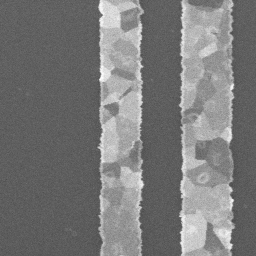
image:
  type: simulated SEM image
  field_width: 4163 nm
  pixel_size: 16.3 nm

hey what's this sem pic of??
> one or a few lines or trenches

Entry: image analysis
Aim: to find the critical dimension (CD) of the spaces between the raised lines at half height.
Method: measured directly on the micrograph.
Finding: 694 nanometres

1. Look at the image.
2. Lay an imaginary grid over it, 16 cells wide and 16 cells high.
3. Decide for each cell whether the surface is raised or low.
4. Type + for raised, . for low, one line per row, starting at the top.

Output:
......+++..+++..
......+++..+++..
......+++..+++..
......+++..+++..
......+++..+++..
......+++..++++.
......+++..+++..
......+++..+++..
......+++..+++..
......+++..+++..
......+++..++++.
......+++..+++..
......+++..+++..
......+++..+++..
......+++..+++..
......+++..+++..